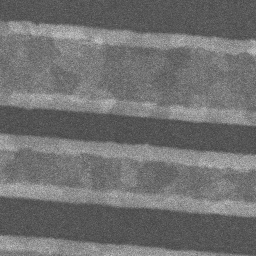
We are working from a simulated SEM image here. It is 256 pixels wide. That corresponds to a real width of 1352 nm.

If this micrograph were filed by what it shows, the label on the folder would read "one or a few lines or trenches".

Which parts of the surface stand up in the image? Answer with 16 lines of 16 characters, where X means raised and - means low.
----------------
----------------
XXXXXXXXX-------
XXXXXXXXXXXXXXXX
XXXXXXXXXXXXXXXX
XXXXXXXXXXXXXXXX
----XXXXXXXXXXXX
----------------
----------------
XXXXXXXX--------
XXXXXXXXXXXXXXXX
XXXXXXXXXXXXXXXX
--------XXXXXXXX
----------------
----------------
XXXX------------